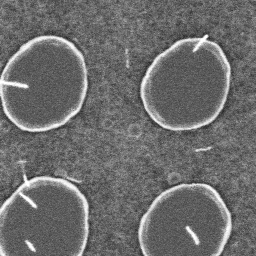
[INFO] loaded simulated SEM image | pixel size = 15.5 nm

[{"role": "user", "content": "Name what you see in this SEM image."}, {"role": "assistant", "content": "raised bodies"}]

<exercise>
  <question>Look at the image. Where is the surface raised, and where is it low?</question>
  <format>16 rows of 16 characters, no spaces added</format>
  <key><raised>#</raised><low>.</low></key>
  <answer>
................
................
..##........#...
.####.....####..
#####....#####..
#####....#####..
#####....#####..
.###......###...
................
................
................
..##............
.####.....####..
#####....#####..
#####....#####..
#####....#####..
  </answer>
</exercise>